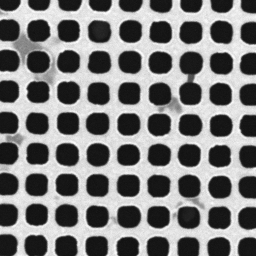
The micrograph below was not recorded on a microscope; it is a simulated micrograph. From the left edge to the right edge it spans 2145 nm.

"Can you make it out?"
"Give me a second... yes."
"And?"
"a regular array of holes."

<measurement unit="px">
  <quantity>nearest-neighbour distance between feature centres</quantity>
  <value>30.3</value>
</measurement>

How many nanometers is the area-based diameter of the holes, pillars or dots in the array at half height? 199